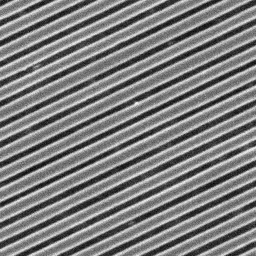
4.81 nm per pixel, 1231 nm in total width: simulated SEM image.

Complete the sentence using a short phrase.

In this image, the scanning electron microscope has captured parallel lines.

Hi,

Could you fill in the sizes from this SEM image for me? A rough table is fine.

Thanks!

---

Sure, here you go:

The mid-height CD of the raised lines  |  0.0558 µm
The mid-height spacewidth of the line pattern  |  30.3 nm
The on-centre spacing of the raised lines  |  87.5 nm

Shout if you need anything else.